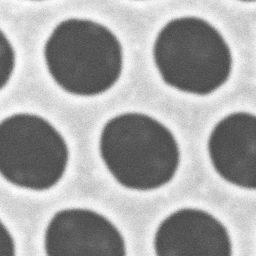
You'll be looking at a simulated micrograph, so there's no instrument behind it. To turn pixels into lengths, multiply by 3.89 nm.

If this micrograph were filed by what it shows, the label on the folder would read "holes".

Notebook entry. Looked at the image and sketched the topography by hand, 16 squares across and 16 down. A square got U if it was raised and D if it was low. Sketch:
UUUUUUUUUUUUUUUU
UUUUDDUUUUDDDUUU
DUUDDDDUUUDDDDUU
DUUDDDDDUUDDDDUU
DUUDDDDDUUDDDDUU
UUUUDDDUUUUDDDUU
UUUUUUUUUUUUUUUU
DDDUUUUDDDUUUUDD
DDDDUUDDDDDUUDDD
DDDDUUDDDDDUUDDD
DDDDUUUDDDDUUDDD
UDDUUUUUDDUUUUUD
UUUUUUUUUUUUUUUU
UUUDDDUUUUUDDUUU
DUUDDDDUUUDDDDUU
DUUDDDDDUUDDDDUU